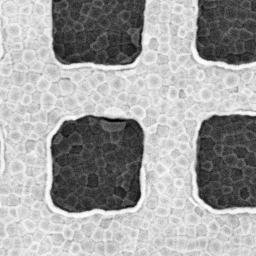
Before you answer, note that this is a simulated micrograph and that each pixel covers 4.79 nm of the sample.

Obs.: holes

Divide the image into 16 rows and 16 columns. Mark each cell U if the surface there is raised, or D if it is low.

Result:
UUUDDDDDDUUUDDDD
UUUDDDDDDUUUDDDD
UUUDDDDDDUUUDDDD
UUUDDDDDDUUUUDDD
UUUUUUUUUUUUUUUU
UUUUUUUUUUUUUUUU
UUUUUUUUUUUUUUUU
UUUUDDDDUUUUUDDD
UUUDDDDDDUUUDDDD
UUUDDDDDDUUUDDDD
UUUDDDDDDUUUDDDD
UUUDDDDDDUUUDDDD
UUUDDDDDDUUUUDDD
UUUUUUUUUUUUUUUU
UUUUUUUUUUUUUUUU
UUUUUUUUUUUUUUUU